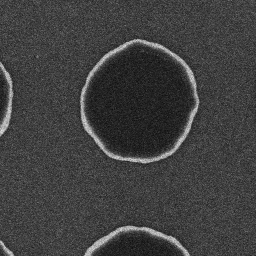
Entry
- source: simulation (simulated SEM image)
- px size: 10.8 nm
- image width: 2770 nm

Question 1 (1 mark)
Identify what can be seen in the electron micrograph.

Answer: raised bodies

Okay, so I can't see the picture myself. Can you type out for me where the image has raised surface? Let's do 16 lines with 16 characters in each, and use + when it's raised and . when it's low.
................
................
................
.......++++.....
......++++++....
+....+++++++....
+....+++++++....
.....+++++++....
......+++++.....
.......++++.....
................
................
................
................
.......+++......
......+++++.....